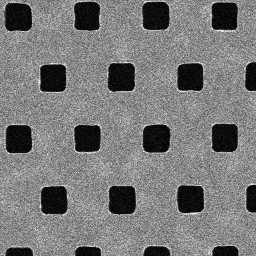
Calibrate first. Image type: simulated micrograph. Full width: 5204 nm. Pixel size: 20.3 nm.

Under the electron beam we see a regular array of holes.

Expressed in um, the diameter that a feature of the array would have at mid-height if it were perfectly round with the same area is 0.604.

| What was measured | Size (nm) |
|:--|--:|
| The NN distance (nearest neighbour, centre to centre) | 1390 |